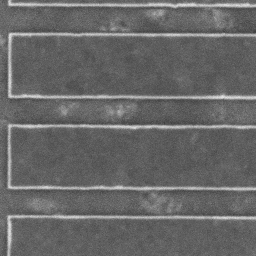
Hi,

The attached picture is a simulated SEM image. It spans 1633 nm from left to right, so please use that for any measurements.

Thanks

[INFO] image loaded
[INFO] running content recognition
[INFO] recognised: one or a few lines or trenches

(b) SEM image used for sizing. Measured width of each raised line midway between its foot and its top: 0.402 um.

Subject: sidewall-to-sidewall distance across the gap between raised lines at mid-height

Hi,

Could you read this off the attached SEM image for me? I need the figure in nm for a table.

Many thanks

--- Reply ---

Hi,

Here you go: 186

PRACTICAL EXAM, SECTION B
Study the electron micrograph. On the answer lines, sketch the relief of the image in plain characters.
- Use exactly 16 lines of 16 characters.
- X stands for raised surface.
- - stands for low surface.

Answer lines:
----------------
----------------
-XXXXXXXXXXXXXXX
-XXXXXXXXXXXXXXX
-XXXXXXXXXXXXXXX
-XXXXXXXXXXXXXXX
----------------
----------------
-XXXXXXXXXXXXXXX
-XXXXXXXXXXXXXXX
-XXXXXXXXXXXXXXX
-XXXXXXXXXXXXXXX
----------------
----------------
-XXXXXXXXXXXXXXX
-XXXXXXXXXXXXXXX